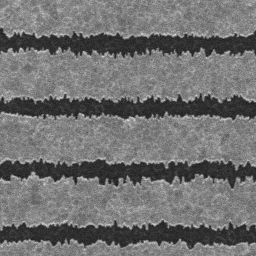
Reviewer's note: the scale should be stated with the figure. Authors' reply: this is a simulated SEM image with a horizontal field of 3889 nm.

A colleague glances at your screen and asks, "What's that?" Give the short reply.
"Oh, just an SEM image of one or a few lines or trenches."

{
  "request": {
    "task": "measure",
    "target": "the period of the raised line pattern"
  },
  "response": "967 nm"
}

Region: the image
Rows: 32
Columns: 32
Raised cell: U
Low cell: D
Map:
UUUUUUUUUUUUUUUUUUUUUUUUUUUUUUUU
UUUUUUUUUUUUUUUUUUUUUUUUUUUUUUUU
UUUUUUUUUUUUUUUUUUUUUUUUUUUUUUUU
UUUUUUUUUUUUUUUUUUUUUUUUUUUUUUUU
DDDDDDDDDDDDDDDUDDDDDDDDDDUUDDDD
DDDDDDDDDDDDDDDDDDDDDDDDDDDDDDDD
DUUUUUDUUDDDDDDDDDDUDDDDDUDDDDDD
UUUUUUUUUUUUUUUUUUUUUUUUUUUUUUUU
UUUUUUUUUUUUUUUUUUUUUUUUUUUUUUUU
UUUUUUUUUUUUUUUUUUUUUUUUUUUUUUUU
UUUUUUUUUUUUUUUUUUUUUUUUUUUUUUUU
UUUUUUUUUUUUUUUUUUUUUUUUUUUUUUUU
DDDDUDDDDDDDDDUDDDDDDDDUDDDUDDDU
DDDDDDDDDDDDDDDDDDDDDDDDDDDDDDDD
UUUDDDDDDDDDDDDDDDDDDDDDDDDDDDDD
UUUUUUUUUUUUUUUUUUUUUUUUUUUUUUUU
UUUUUUUUUUUUUUUUUUUUUUUUUUUUUUUU
UUUUUUUUUUUUUUUUUUUUUUUUUUUUUUUU
UUUUUUUUUUUUUUUUUUUUUUUUUUUUUUUU
UUUUUUUUUUUUUUUUUUUUUUUUUUUUUUUU
DDDDDDDDUDDDDDDDDDDDUDDDDDDDDUDU
DDDDDDDDDDDDDDDDDDDDDDDDDDDDDDDD
DUUUUUDDUDUUDDDDDDUDDDDDUUUDDDDU
UUUUUUUUUUUUUUUUUUUUUUUUUUUUUUUU
UUUUUUUUUUUUUUUUUUUUUUUUUUUUUUUU
UUUUUUUUUUUUUUUUUUUUUUUUUUUUUUUU
UUUUUUUUUUUUUUUUUUUUUUUUUUUUUUUU
UUUUUUUUUUUUUUUUUUUUUUUUUUUUUUUU
DDDDDDDDDDDDDDDDDDDDDDDDDDDUDDDD
DDDDDDDDDDDDDDDDDDDDDDDDDDDDDDDD
UUUUUUDDUUDDUDDDDUUUUUUDDDDDDDUD
UUUUUUUUUUUUUUUUUUUUUUUUUUUUUUUU